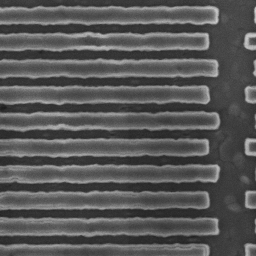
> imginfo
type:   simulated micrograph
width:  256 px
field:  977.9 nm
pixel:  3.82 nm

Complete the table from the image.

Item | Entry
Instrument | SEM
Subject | parallel lines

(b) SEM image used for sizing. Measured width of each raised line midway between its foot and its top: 0.0598 micrometres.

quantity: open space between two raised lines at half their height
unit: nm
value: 38.7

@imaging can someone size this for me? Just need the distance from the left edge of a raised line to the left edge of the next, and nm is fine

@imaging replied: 101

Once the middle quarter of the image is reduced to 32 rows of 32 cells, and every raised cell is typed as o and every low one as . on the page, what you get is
oooooooooooooooooooooooooooooooo
oooooooooooooooooooooooooooooooo
oooooooooooooooooooooooooooooooo
................................
................................
................................
oooooooooooooooooooooooooooooooo
oooooooooooooooooooooooooooooooo
oooooooooooooooooooooooooooooooo
ooooo...........o..o...ooo......
................................
................................
o..ooooooooooooooooooo.ooooooooo
oooooooooooooooooooooooooooooooo
oooooooooooooooooooooooooooooooo
oooooooooooooooooooooooooooooooo
................................
................................
................................
oooooooooooooooooooooooooooooooo
oooooooooooooooooooooooooooooooo
oooooooooooooooooooooooooooooooo
oooooooooooooooooooooooooooooooo
................................
................................
..o...ooo.ooo.o..........o.....o
oooooooooooooooooooooooooooooooo
oooooooooooooooooooooooooooooooo
oooooooooooooooooooooooooooooooo
.ooooo......................o...
................................
................................